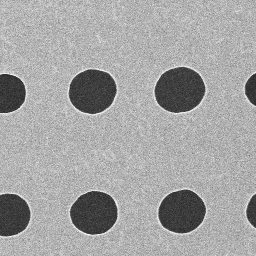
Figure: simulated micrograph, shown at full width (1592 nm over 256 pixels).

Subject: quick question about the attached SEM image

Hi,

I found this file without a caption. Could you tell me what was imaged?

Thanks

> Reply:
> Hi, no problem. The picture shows holes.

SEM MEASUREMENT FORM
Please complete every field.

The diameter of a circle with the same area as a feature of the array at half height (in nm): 285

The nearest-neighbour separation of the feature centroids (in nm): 545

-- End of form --